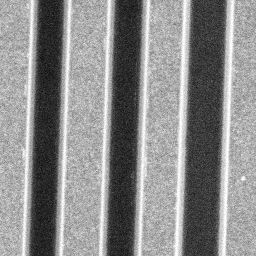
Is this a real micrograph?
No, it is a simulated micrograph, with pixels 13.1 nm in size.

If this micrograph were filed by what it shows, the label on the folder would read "one or a few lines or trenches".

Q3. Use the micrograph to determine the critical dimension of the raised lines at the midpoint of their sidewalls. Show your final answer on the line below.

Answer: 558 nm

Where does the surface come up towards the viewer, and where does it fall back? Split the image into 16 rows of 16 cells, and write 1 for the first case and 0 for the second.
1100111001110011
1100111001110011
1100111001110011
1100111001110011
1100111001110011
1100111001110011
1100111001100011
1100111001100011
1100111001100011
1100111001100011
1100111001100011
1100111001100011
1100111001100011
1100110001100011
1100110001100011
1100110001100011